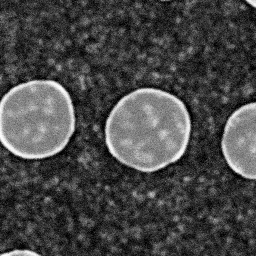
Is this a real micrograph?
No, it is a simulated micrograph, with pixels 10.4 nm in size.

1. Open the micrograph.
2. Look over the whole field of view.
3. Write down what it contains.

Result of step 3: raised bodies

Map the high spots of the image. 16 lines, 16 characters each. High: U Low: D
DDDDDDDDDDDDDDDD
DDDDDDDDDDDDDDDD
DDDDDDDDDDDDDDDD
DDDDDDDDDDDDDDDD
DDDDDDDDDDDDDDDD
DUUUDDDDDDDDDDDD
UUUUDDDUUUUDDDDD
UUUUUDDUUUUUDDUU
UUUUDDDUUUUUDDUU
DUUUDDDUUUUDDDUU
DDDDDDDDUUDDDDDU
DDDDDDDDDDDDDDDD
DDDDDDDDDDDDDDDD
DDDDDDDDDDDDDDDD
DDDDDDDDDDDDDDDD
DDDDDDDDDDDDDDDD